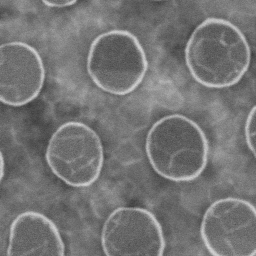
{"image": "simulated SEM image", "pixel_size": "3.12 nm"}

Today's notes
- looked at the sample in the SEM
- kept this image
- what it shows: raised bodies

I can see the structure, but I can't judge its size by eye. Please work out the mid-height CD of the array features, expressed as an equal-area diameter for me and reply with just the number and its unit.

188 nanometers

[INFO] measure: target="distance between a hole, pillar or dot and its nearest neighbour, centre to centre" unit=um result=0.315